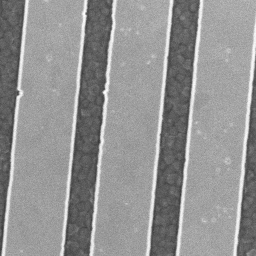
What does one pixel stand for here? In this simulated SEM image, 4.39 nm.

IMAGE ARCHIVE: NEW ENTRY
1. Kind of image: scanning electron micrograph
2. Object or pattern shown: one or a few lines or trenches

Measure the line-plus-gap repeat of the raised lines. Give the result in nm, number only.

380